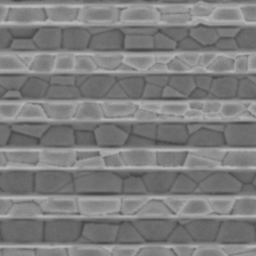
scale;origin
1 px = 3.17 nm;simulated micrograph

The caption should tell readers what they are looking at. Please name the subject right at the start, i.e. parallel lines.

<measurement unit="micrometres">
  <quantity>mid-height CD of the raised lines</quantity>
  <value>0.067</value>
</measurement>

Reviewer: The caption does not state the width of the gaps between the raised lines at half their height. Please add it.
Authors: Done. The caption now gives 0.0876 um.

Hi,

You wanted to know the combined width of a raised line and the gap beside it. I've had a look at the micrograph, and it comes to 152 nm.